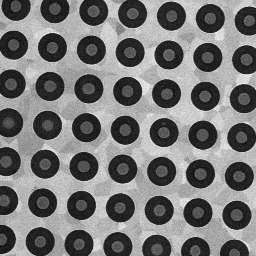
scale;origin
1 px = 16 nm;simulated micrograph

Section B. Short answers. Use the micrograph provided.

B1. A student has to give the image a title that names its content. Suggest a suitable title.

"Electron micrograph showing an array of small figures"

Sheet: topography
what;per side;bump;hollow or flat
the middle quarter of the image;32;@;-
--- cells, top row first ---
@@@@@@@@@@@@@@@---@@@@@@-----@@@
@@@@@@@@@@@@@@@@@@@@@@@@@@@@@@@@
@@@@@@-@@@@@@@@@@@@@@@@@@@@@@@@@
@@@@-----@@@@@---@@@@@@@@@@@@@@@
@@@------@@@@------@@@@-----@@@@
@@@-------@@-------@@@@------@@@
@@--------@@--------@@-------@@@
@@@-------@@--------@@-------@@@
@@@------@@@@------@@@-------@@@
@@@@@---@@@@@-----@@@@@------@@@
@@@@@@@@@@@@@@@-@@@@@@@@----@@@@
@@@@@@@@@@@@@@@@@@@@@@@@@@@@@@@@
@@@@---@@@@@@@@@@@@@@@@@@@@@@@@@
@@@-----@@@@@----@@@@@@@@-@@@@@@
@@-------@@@------@@@@------@@@@
@@-------@@@-------@@@------@@@@
@@-------@@@-------@@--------@@-
@@-------@@@-------@@--------@@-
@@@-----@@@@------@@@@------@@@-
@@@@@-@@@@@@@-----@@@@------@@@-
@@@@@@@@@@@@@@@@@@@@@@@----@@@@@
@@@@@@@@@@@@@@@@@@@@@@@@@@@@@@@@
@@@----@@@@@@@@@@@@@@@@@@@@@@@@@
@@------@@@@-----@@@@@@---@@@@@@
@@-------@@-------@@@@-----@@@@@
@--------@@-------@@@-------@@@-
@--------@@-------@@@-------@@@-
@@------@@@-------@@@-------@@--
@@@----@@@@@------@@@-------@@@-
@@@@@@@@@@@@@---@@@@@@-----@@@@-
@@@@@@@@@@@@@@@@@@@@@@@@-@@@@@@@
@@@@@@@@@@@@@@@@@@@@@@@@@@@@@@@@